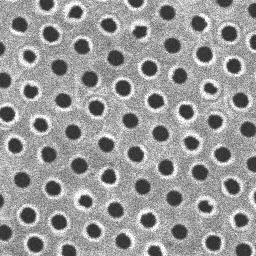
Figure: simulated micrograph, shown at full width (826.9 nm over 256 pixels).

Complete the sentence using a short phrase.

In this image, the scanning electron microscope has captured a regular array of holes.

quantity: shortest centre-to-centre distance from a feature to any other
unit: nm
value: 102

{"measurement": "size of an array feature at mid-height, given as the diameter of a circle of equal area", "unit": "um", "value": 0.0496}